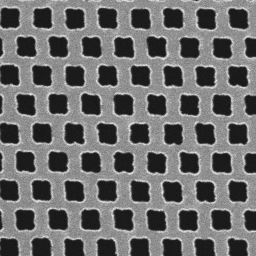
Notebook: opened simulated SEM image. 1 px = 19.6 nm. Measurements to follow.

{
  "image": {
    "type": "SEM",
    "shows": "a regular array of holes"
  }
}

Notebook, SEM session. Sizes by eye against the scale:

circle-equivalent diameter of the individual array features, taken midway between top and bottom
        420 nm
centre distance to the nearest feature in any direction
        32.3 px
